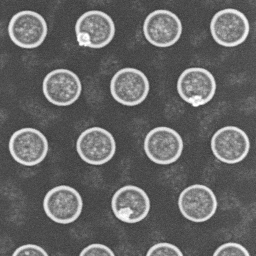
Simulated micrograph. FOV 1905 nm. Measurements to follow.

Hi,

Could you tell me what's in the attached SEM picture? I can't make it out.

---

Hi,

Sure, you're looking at a regular array of raised bodies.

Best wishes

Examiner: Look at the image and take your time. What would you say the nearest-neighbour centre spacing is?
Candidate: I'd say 497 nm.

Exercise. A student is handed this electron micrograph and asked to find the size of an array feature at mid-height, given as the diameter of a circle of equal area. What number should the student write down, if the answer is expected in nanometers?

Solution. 260